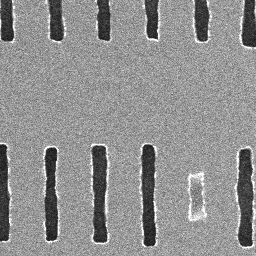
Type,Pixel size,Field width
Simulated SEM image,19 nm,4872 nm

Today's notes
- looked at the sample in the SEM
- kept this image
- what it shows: holes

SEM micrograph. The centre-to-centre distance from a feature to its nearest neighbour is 928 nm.